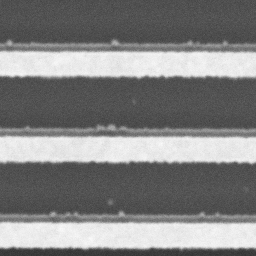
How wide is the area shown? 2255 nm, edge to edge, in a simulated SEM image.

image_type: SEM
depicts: lines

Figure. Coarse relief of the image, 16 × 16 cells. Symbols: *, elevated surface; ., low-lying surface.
................
................
................
****************
****************
................
................
................
****************
****************
................
................
................
****************
****************
................